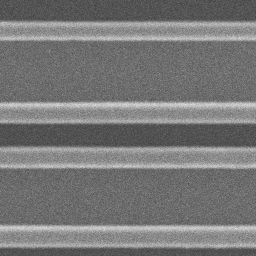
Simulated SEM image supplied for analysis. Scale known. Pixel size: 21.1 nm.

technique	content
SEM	lines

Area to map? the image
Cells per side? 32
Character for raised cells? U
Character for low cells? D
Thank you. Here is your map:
DDDDDDDDDDDDDDDDDDDDDDDDDDDDDDDD
DDDDDDDDDDDDDDDDDDDDDDDDDDDDDDDD
DDDDDDDDDDDDDDDDDDDDDDDDDDDDDDDD
UUUUUUUUUUUUUUUUUUUUUUUUUUUUUUUU
UUUUUUUUUUUUUUUUUUUUUUUUUUUUUUUU
DDDDDDDDDDDDDDDDDDDDDDDDDDDDDDDD
DDDDDDDDDDDDDDDDDDDDDDDDDDDDDDDD
DDDDDDDDDDDDDDDDDDDDDDDDDDDDDDDD
DDDDDDDDDDDDDDDDDDDDDDDDDDDDDDDD
DDDDDDDDDDDDDDDDDDDDDDDDDDDDDDDD
DDDDDDDDDDDDDDDDDDDDDDDDDDDDDDDD
DDDDDDDDDDDDDDDDDDDDDDDDDDDDDDDD
DDDDDDDDDDDDDDDDDDDDDDDDDDDDDDDD
UUUUUUUUUUUUUUUUUUUUUUUUUUUUUUUU
UUUUUUUUUUUUUUUUUUUUUUUUUUUUUUUU
DDDDDDDDDDDDDDDDDDDDDDDDDDDDDDDD
DDDDDDDDDDDDDDDDDDDDDDDDDDDDDDDD
DDDDDDDDDDDDDDDDDDDDDDDDDDDDDDDD
DDDDDDDDDDDDDDDDDDDDDDDDDDDDDDDD
UUUUUUUUUUUUUUUUUUUUUUUUUUUUUUUU
UUUUUUUUUUUUUUUUUUUUUUUUUUUUUUUU
DDDDDDDDDDDDDDDDDDDDDDDDDDDDDDDD
DDDDDDDDDDDDDDDDDDDDDDDDDDDDDDDD
DDDDDDDDDDDDDDDDDDDDDDDDDDDDDDDD
DDDDDDDDDDDDDDDDDDDDDDDDDDDDDDDD
DDDDDDDDDDDDDDDDDDDDDDDDDDDDDDDD
DDDDDDDDDDDDDDDDDDDDDDDDDDDDDDDD
DDDDDDDDDDDDDDDDDDDDDDDDDDDDDDDD
UUUUUUUUUUUUUUUUUUUUUUUUUDDUUUDD
UUUUUUUUUUUUUUUUUUUUUUUUUUUUUUUU
UUUUUUUUUUUUUUUUUUUUUUUUUUUUUUUU
DDDDDDDDDDDDDDDDDDDDDDDDDDDDDDDD